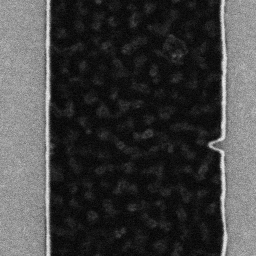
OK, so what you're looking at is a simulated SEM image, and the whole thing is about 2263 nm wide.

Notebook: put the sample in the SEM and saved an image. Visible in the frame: one or a few lines or trenches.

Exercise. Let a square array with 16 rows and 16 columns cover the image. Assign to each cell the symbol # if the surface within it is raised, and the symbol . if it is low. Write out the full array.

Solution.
...###########..
...###########..
...###########..
...###########..
...###########..
...###########..
...###########..
...###########..
...###########..
...###########..
...###########..
...###########..
...###########..
...###########..
...###########..
...###########..